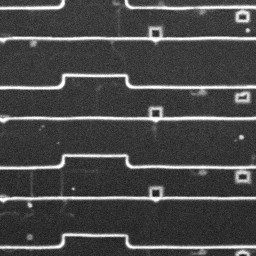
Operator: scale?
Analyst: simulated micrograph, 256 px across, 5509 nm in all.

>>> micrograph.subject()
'wiring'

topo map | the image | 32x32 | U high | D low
UUUUUUUUDDDDDDDDUUUUUUUUUUUUUUUU
DDDDDDDDDDDDDDDDDDDDDDDDDDDDDDDD
DDDDDDDDDDDDDDDDDDDDDDDDDDDDDDDD
DDDDDDDDDDDDDDDDDDDDDDDDDDDDDDDD
DDDDDDDDDDDDDDDDDDDDDDDDDDDDDDDD
UUUUUUUUUUUUUUUUUUUUUUUUUUUUUUUU
UUUUUUUUUUUUUUUUUUUUUUUUUUUUUUUU
UUUUUUUUUUUUUUUUUUUUUUUUUUUUUUUU
UUUUUUUUUUUUUUUUUUUUUUUUUUUUUUUU
UUUUUUUUDDUUUUUUUUUUUUUUUUUUUUUU
UUUUUUUUDDDDDDDDUUUUUUUUUUUUUUUU
DDDDDDDDDDDDDDDDDDDDDDDDDDDDDDDD
DDDDDDDDDDDDDDDDDDDDDDDDDDDDDDDD
DDDDDDDDDDDDDDDDDDDDDDDDDDDDDDDD
DDDDDDDDDDDDDDDDDDDDDDDDDDDDDDDD
UUUUUUUUUUUUUUUUUUUUUUUUUUUUUUUU
UUUUUUUUUUUUUUUUUUUUUUUUUUUUUUUU
UUUUUUUUUUUUUUUUUUUUUUUUUUUUUUUU
UUUUUUUUUUUUUUUUUUUUUUUUUUUUUUUU
UUUUUUUUDUUUUUUUUUUUUUUUUUUUUUUU
UUUUUUUUDDDDDDDDUUUUUUUUUUUUUUUU
DDDDDDDDDDDDDDDDDDDDDDDDDDDDDDDD
DDDDDDDDDDDDDDDDDDDDDDDDDDDDDDDD
DDDDDDDDDDDDDDDDDDDDDDDDDDDDDDDD
DDDDDDDDDDDDDDDDDDDDDDDDDDDDDDDD
UUUUUUUUUUUUUUUUUUUUUUUUUUUUUUUU
UUUUUUUUUUUUUUUUUUUUUUUUUUUUUUUU
UUUUUUUUUUUUUUUUUUUUUUUUUUUUUUUU
UUUUUUUUUUUUUUUUUUUUUUUUUUUUUUUU
UUUUUUUUDDDDDDDUUUUUUUUUUUUUUUUU
UUUUUUUUDDDDDDDDUUUUUUUUUUUUUUUU
DDDDDDDDDDDDDDDDDDDDDDDDDDDDDDDD